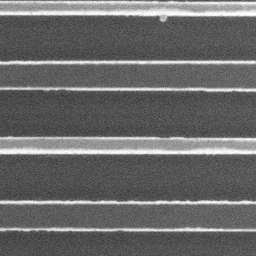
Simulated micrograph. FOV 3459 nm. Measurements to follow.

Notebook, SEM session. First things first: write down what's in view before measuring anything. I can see lines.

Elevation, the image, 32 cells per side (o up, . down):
oooooooooooooooooooooooooooooooo
oooooooooooooooooooooooooooooooo
................................
................................
................................
................................
................................
................................
oooooooooooooooooooooooooooooooo
oooooooooooooooooooooooooooooooo
oooooooooooooooooooooooooooooooo
................................
................................
................................
................................
................................
................................
oooooooooooooooooooooooooooooooo
oooooooooooooooooooooooooooooooo
................................
................................
................................
................................
................................
................................
oooooooooooooooooooooooooooooooo
oooooooooooooooooooooooooooooooo
oooooooooooooooooooooooooooooooo
oooooooooooooooooooooooooooooooo
................................
................................
................................